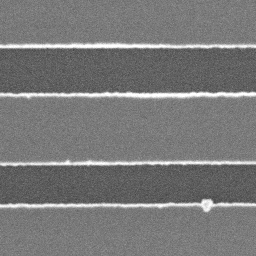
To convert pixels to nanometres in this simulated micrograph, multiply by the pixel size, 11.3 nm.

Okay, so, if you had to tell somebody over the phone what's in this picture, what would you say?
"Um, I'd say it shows lines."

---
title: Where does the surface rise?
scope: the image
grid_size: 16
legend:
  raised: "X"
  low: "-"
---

XXXXXXXXXXXXXXXX
XXXXXXXXXXXXXXXX
XXXXXXXXXXXXXXXX
----------------
----------------
----------------
XXXXXXXXXXXXXXXX
XXXXXXXXXXXXXXXX
XXXXXXXXXXXXXXXX
XXXXXXXXXXXXXXXX
----------------
----------------
----------------
XXXXXXXXXXXXXXXX
XXXXXXXXXXXXXXXX
XXXXXXXXXXXXXXXX